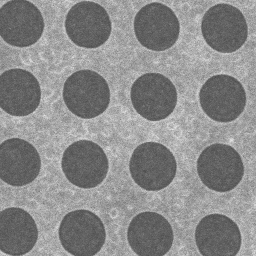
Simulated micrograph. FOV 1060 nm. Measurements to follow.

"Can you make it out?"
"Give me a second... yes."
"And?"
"a regular array of holes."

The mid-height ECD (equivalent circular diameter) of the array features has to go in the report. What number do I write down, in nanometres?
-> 198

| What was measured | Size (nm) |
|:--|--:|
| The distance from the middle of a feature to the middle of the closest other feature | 280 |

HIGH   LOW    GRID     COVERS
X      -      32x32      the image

X---XXXXX---XXXXXXX-XXXXXXX--XXX
-----XXXX----XXXX-----XXXX----XX
-----XXX------XXX-----XXX------X
------XX------XXX-----XXX------X
-----XXXX-----XXX-----XXX------X
X---XXXXX----XXXXX----XXXX----XX
XXXXXXXXXXXXXXXXXXXXXXXXXXX--XXX
XXXXXXXXXXXXXXXXXXXXXXXXXXXXXXXX
XXXXXXXXXXXXXXXXXXXXXXXXXXXXXXXX
----XXXXX----XXXXX---XXXXXX--XXX
-----XXX-----XXXX-----XXX-----XX
-----XXX------XX------XXX------X
-----XXX------XX------XXX------X
-----XXXX----XXXX-----XXX------X
XX-XXXXXXX--XXXXXX---XXXXX----XX
XXXXXXXXXXXXXXXXXXXXXXXXXXXXXXXX
XXXXXXXXXXXXXXXXXXXXXXXXXXXXXXXX
X--XXXXXXX-XXXXXXXXXXXXXXXXXXXXX
----XXXX-----XXXX----XXXXX---XXX
-----XXX-----XXX------XXX-----XX
-----XXX------XX------XXX-----XX
-----XXX-----XXX------XXX-----XX
----XXXXX----XXXX-----XXX-----XX
XXXXXXXXXX--XXXXXX---XXXXX---XXX
XXXXXXXXXXXXXXXXXXXXXXXXXXXXXXXX
XXXXXXXXXXXXXXXXXXXXXXXXXXXXXXXX
---XXXXXX---XXXXXX-XXXXXXXXXXXXX
----XXXX-----XXX-----XXXX----XXX
-----XX------XXX------XX------XX
-----XX------XXX------XX------XX
----XXXX-----XXX-----XXXX-----XX
----XXXXX---XXXXX----XXXX-----XX